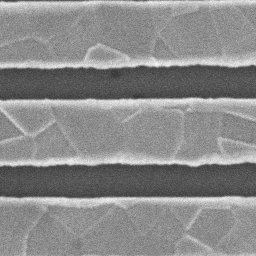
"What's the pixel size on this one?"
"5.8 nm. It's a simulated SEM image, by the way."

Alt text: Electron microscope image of lines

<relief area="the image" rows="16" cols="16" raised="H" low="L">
HHHHHHHHHHHHHHHH
HHHHHHHHHHHHHHHH
HHHHHHHHHHHHHHHH
HHHHHHHHHHHHHHHH
LLLLLLLLLLLLLLLL
LLLLLLLLLLLLLLLL
HHHHHHHHHHHHHHHH
HHHHHHHHHHHHHHHH
HHHHHHHHHHHHHHHH
HHHHHHHHHHHHHHHH
LLLLLLLLLLLLLLLL
LLLLLLLLLLLLLLLL
HHHHHHHHHHHHHHHH
HHHHHHHHHHHHHHHH
HHHHHHHHHHHHHHHH
HHHHHHHHHHHHHHHH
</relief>